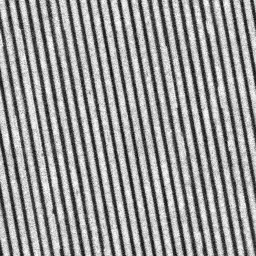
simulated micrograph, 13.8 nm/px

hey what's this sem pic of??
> parallel lines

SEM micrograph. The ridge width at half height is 81.2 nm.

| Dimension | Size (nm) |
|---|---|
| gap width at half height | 57.5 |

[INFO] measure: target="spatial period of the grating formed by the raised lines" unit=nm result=138